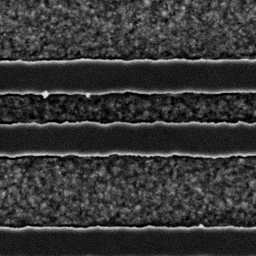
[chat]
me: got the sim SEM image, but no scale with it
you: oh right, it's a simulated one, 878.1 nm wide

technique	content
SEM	lines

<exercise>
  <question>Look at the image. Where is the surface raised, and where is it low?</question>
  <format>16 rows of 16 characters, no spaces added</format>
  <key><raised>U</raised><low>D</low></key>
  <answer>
DDDDDDDDDDDDDDDD
DDDDDDDDDDDDDDDD
DDDDDDDDDDDDDDDD
DDDDDDDDDDDDDDDD
UUUUUUUUUUUUUUUU
UUUUUUUUUUUUUUUU
DDDDDDDDDDDDDDDD
DDDDDDDDDDDDDDDD
UUUUUUUUUUUUUUUU
UUUUUUUUUUUUUUUU
DDDDDDDDDDDDDDDD
DDDDDDDDDDDDDDDD
DDDDDDDDDDDDDDDD
DDDDDDDDDDDDDDDD
UUUUUUUUUUUUUUUU
UUUUUUUUUUUUUUUU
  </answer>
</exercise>